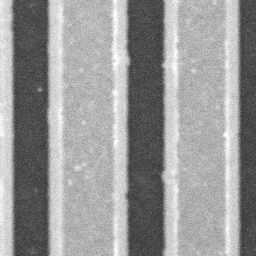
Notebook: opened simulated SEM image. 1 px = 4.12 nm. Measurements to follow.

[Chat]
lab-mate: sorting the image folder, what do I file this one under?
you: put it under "one or a few lines or trenches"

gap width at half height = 204 nanometres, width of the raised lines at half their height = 261 nm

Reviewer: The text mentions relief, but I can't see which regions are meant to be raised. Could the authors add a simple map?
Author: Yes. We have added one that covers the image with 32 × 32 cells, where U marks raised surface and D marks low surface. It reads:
UDDDDDDUUUUUUUUDDDDDDUUUUUUUUDDD
UDDDDDDUUUUUUUUDDDDDDUUUUUUUUDDD
UDDDDDDUUUUUUUUDDDDDDUUUUUUUUDDD
UDDDDDDUUUUUUUUDDDDDDUUUUUUUUDDD
UDDDDDDUUUUUUUUDDDDDDUUUUUUUUDDD
UDDDDDDUUUUUUUUDDDDDDUUUUUUUUDDD
UDDDDDDUUUUUUUUDDDDDDUUUUUUUUDDD
UDDDDDDUUUUUUUUDDDDDDUUUUUUUUDDD
UDDDDDDUUUUUUUUDDDDDDUUUUUUUUDDD
UDDDDDDUUUUUUUUDDDDDDUUUUUUUUDDD
UDDDDDDUUUUUUUUDDDDDDUUUUUUUUDDD
UDDDDDDUUUUUUUUDDDDDDUUUUUUUUDDD
UDDDDDDUUUUUUUUDDDDDDUUUUUUUUDDD
UDDDDDDUUUUUUUUDDDDDDUUUUUUUUDDD
UDDDDDDUUUUUUUUDDDDDDUUUUUUUUDDD
UDDDDDDUUUUUUUUDDDDDDUUUUUUUUDDD
UDDDDDDUUUUUUUUDDDDDDUUUUUUUUDDD
UDDDDDDUUUUUUUUDDDDDDUUUUUUUUDDD
UDDDDDDUUUUUUUUDDDDDDUUUUUUUUDDD
UDDDDDDUUUUUUUUDDDDDDUUUUUUUUDDD
UDDDDDDUUUUUUUUDDDDDDDUUUUUUUDDD
UDDDDDDUUUUUUUUDDDDDDUUUUUUUUDDD
UDDDDDDUUUUUUUUDDDDDDUUUUUUUUDDD
UDDDDDDUUUUUUUUDDDDDDUUUUUUUUDDD
UDDDDDDUUUUUUUUDDDDDDUUUUUUUUDDD
UDDDDDDUUUUUUUUDDDDDDUUUUUUUUDDD
UDDDDDDUUUUUUUUDDDDDDUUUUUUUUDDD
UDDDDDDUUUUUUUUDDDDDDUUUUUUUUDDD
UDDDDDDUUUUUUUUDDDDDDUUUUUUUUDDD
UDDDDDDUUUUUUUUDDDDDDUUUUUUUUDDD
UDDDDDDUUUUUUUUDDDDDDUUUUUUUUDDD
UDDDDDDUUUUUUUUDDDDDDUUUUUUUUDDD